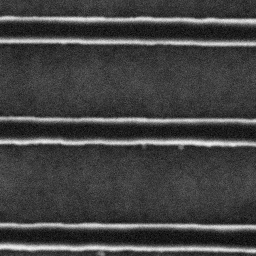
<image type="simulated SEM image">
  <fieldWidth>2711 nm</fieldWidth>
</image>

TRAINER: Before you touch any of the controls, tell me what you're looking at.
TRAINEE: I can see lines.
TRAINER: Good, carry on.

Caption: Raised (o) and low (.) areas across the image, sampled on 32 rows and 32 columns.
................................
................................
oooooooooooooooooooooooooooooooo
oooooooooooooooooooooooooooooooo
oooooooooooooooooooooooooooooooo
.......................ooooooooo
................................
................................
................................
................................
................................
................................
................................
................................
................................
oooooooooooooooooooooooooooooooo
oooooooooooooooooooooooooooooooo
oooooooooooooooooooooooooooooooo
................................
................................
................................
................................
................................
................................
................................
................................
................................
................................
oooooooooooooooooooooooooooooooo
oooooooooooooooooooooooooooooooo
oooooooooooooooooooooooooooooooo
................................